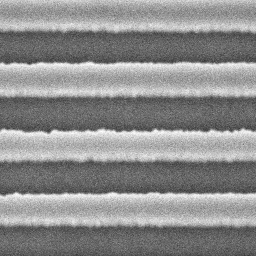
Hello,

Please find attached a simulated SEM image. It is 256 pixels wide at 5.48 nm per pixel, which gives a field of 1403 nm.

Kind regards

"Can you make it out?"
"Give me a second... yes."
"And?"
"lines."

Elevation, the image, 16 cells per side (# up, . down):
################
################
................
................
################
################
................
................
################
################
................
................
################
################
................
................